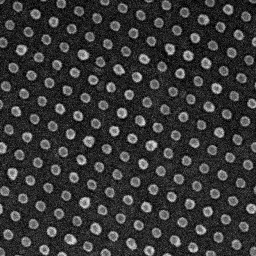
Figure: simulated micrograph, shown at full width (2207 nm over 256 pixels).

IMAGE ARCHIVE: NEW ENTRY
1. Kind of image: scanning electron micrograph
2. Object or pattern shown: a regular array of raised bodies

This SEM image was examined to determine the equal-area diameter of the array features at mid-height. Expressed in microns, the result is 0.0778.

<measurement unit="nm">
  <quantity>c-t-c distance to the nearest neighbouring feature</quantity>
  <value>166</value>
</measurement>